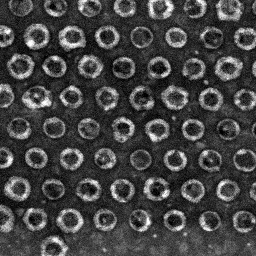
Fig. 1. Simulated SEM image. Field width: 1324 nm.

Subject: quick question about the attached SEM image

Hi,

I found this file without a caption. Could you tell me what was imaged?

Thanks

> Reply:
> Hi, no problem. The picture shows a regular array of raised bodies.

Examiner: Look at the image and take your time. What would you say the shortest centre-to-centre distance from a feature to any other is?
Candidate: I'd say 177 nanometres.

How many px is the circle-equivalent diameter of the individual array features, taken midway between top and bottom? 22.1